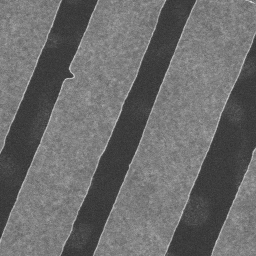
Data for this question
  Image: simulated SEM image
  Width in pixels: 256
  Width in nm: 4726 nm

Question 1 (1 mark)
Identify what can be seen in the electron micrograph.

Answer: one or a few lines or trenches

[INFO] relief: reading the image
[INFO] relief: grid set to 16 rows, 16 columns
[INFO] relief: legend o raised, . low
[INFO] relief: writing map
oooo..oooo..oooo
ooo...oooo..oooo
ooo..oooo..ooooo
oo...oooo..oooo.
oo..ooooo.ooooo.
oo..oooo..ooooo.
o..ooooo..oooo..
o..oooo..ooooo..
...oooo..oooo...
..oooo...oooo...
..oooo..ooooo...
.ooooo..oooo...o
.oooo..ooooo...o
.oooo..oooo...oo
oooo..ooooo...oo
oooo..ooooo..ooo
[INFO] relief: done